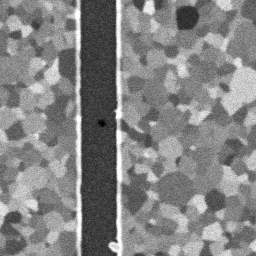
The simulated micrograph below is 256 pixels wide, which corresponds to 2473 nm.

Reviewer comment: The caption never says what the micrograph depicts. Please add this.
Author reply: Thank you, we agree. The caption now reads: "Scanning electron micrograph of one or a few lines or trenches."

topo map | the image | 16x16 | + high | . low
+++++..+++++++++
+++++..+++++++++
+++++..+++++++++
+++++..+++++++++
+++++..+++++++++
+++++..+++++++++
+++++..+++++++++
+++++..+++++++++
+++++..+++++++++
+++++..+++++++++
+++++..+++++++++
+++++..+++++++++
+++++..+++++++++
+++++..+++++++++
+++++..+++++++++
+++++..+++++++++